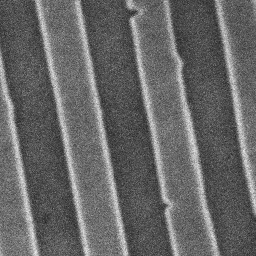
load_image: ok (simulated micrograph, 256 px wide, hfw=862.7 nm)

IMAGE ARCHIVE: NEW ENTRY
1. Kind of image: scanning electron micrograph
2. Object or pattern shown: one or a few lines or trenches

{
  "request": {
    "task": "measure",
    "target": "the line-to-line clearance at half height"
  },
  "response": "0.165 µm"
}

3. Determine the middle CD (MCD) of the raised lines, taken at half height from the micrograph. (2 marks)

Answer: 128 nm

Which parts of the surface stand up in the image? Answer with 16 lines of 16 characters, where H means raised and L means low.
LLHHHLLLHHHLLLHH
LLLHHLLLHHHLLLHH
LLLHHLLLHHHLLLHH
LLLHHHLLLHHLLLHH
LLLHHHLLLHHLLLHH
LLLHHHLLLHHLLLLH
HLLLHHLLLHHHLLLH
HLLLHHLLLHHHLLLH
HLLLHHLLLLHHLLLH
HLLLHHHLLLHHLLLH
HLLLHHHLLLHHLLLH
HLLLLHHLLLHHHLLL
HHLLLHHLLLHHHLLL
HHLLLHHLLLHHHLLL
HHLLLHHHLLLHHLLL
HHLLLHHHLLLHHLLL